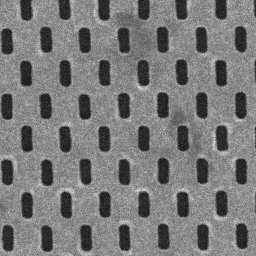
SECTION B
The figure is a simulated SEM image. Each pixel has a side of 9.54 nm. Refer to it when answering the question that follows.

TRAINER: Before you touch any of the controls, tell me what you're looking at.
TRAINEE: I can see a regular array of holes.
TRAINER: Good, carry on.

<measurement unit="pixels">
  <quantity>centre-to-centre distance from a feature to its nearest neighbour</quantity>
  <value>37.8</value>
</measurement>